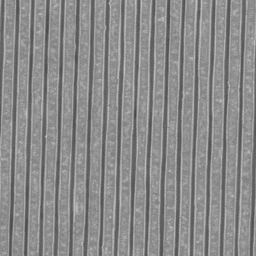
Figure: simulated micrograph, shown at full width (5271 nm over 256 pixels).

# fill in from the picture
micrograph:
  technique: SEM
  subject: parallel lines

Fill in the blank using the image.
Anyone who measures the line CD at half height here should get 214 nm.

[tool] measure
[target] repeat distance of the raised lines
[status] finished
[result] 310 nanometres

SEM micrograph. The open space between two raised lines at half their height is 0.0952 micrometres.